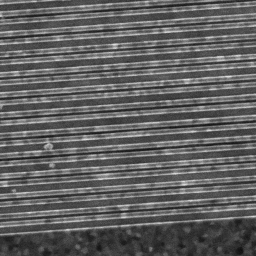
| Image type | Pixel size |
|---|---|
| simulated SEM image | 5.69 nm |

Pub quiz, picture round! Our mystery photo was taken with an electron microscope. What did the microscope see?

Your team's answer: parallel lines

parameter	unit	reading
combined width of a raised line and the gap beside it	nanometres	57.1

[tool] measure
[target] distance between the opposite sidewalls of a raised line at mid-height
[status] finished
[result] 26.9 nanometers